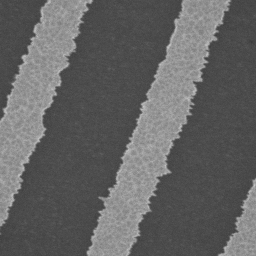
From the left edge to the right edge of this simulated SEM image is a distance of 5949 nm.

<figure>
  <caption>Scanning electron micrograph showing one or a few lines or trenches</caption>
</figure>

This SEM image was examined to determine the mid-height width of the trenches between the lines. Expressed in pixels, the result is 89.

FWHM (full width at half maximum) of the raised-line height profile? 36.5 px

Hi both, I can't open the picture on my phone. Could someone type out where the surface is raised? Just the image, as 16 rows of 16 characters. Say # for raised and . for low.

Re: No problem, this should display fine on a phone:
...##......###..
..###......###..
..###......##...
..##......###...
.###......###...
.##......###....
###......###....
###......###....
###.....###.....
##......###.....
#.......##......
#......###......
#......##......#
......###......#
......###......#
......##......##